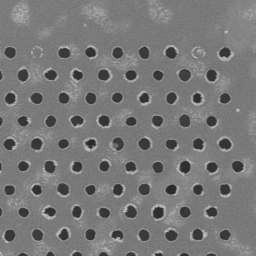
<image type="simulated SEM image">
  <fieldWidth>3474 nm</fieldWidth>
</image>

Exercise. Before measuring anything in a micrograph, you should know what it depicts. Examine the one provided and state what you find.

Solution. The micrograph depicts a regular array of holes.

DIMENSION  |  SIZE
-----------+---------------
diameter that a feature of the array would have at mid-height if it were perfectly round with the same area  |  151 nanometres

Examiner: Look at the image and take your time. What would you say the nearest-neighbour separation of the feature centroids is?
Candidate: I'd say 0.351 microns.